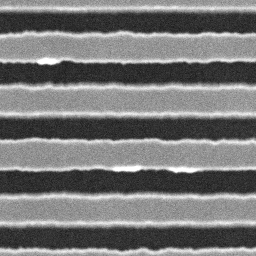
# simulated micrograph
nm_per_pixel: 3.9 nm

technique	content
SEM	lines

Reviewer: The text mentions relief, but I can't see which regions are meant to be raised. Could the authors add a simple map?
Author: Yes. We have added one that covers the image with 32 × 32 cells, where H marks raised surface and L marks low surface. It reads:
HHHHHHHHHHHHHHHHHHHHHHHHHHHHHHHH
LLLLLLLLLLLLLLLLLLLLLLLLLLLLLLLL
LLLLLLLLLLLLLLLLLLLLLLLLLLLLLLLL
LLLLLLLLLLLLLLLLLLLLLLLLLLLLLLLL
HHHHHHHHHHHHHHHHHHHHHHHHHHHHHHHH
HHHHHHHHHHHHHHHHHHHHHHHHHHHHHHHH
HHHHHHHHHHHHHHHHHHHHHHHHHHHHHHHH
HHHHHHHHLHHHHHHHHHHHHHHHHHHHHHHH
LLLLLLLLLLLLLLLLLLLLLLLLLLLLLLLL
LLLLLLLLLLLLLLLLLLLLLLLLLLLLLLLL
LLLLLLLLLLLLLLLLLLLLLLLLLLLLLLLL
HHHHHHHHHHHHHHHHHHHHHHHHHHHHHHHH
HHHHHHHHHHHHHHHHHHHHHHHHHHHHHHHH
HHHHHHHHHHHHHHHHHHHHHHHHHHHHHHHH
LLLLLLLLLLLLLLLLLLLLLLLLLLLLLLLL
LLLLLLLLLLLLLLLLLLLLLLLLLLLLLLLL
LLLLLLLLLLLLLLLLLLLLLLLLLLLLLLLL
LLLHHHHHHHLLLLLLHLHHLLLHLLLLLLLL
HHHHHHHHHHHHHHHHHHHHHHHHHHHHHHHH
HHHHHHHHHHHHHHHHHHHHHHHHHHHHHHHH
HHHHHHHHHHHHHHHHHHHHHHHHHHHHHHHH
LLLLLLLLLLLLLLLLLLLLLLLLLLLLLLLL
LLLLLLLLLLLLLLLLLLLLLLLLLLLLLLLL
LLLLLLLLLLLLLLLLLLLLLLLLLLLLLLLL
LLLLLLHHHLLLLHHLLHHHLLLLLLLLHLLL
HHHHHHHHHHHHHHHHHHHHHHHHHHHHHHHH
HHHHHHHHHHHHHHHHHHHHHHHHHHHHHHHH
HHHHHHHHHHHHHHHHHHHHHHHHHHHHHHHH
LLLLLLLLLLLLLLLLLLLLLLLLLLLLLLLL
LLLLLLLLLLLLLLLLLLLLLLLLLLLLLLLL
LLLLLLLLLLLLLLLLLLLLLLLLLLLLLLLL
HHHHHHHHHHHHHHHHHHHHHHHHHHHHHHHH